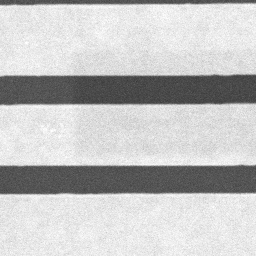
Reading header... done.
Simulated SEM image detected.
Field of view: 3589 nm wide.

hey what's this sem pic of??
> lines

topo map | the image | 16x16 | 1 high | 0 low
1111111111111111
1111111111111111
1111111111111111
1111111111111111
1111111111111111
0000000000000000
0000000000000001
1111111111111111
1111111111111111
1111111111111111
0000000000000000
0000000000000000
1111111111111111
1111111111111111
1111111111111111
1111111111111111